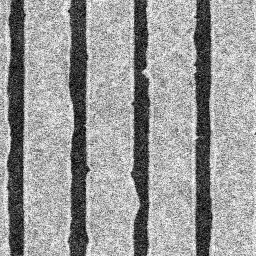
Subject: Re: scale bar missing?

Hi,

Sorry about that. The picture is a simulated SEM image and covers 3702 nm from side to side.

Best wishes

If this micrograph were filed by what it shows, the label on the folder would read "one or a few lines or trenches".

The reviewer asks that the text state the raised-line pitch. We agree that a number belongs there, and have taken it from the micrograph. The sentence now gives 897 nm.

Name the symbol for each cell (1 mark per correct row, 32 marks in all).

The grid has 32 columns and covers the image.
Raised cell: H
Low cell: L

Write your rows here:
HLLHHHHHLLLHHHHHLLLHHHHHLLLHHHHH
HLLHHHHHLLLHHHHHLLLHHHHHLLLHHHHH
HLLHHHHHLLLHHHHHLLLHHHHHLLLHHHHH
HLLHHHHHLLLHHHHHLLLHHHHHLLLHHHHH
HLLHHHHHHLLHHHHHLLLHHHHHLLLHHHHH
HLLHHHHHHLLHHHHHLLLHHHHHLLLHHHHH
HLLHHHHHHLLHHHHHLLLHHHHHLLLHHHHH
HLLHHHHHHLLHHHHHLLLHHHHHLLLHHHHH
HLLHHHHHHLLHHHHHLLLHHHHHLLLHHHHH
HLLHHHHHHLLHHHHHLLLHHHHHLLLHHHHH
HLLHHHHHHLLHHHHHLLLHHHHHLLLHHHHH
HLLHHHHHHLLHHHHHLLLHHHHHLLLHHHHH
HLLHHHHHHLLHHHHHLLLHHHHHLLLHHHHH
HLLHHHHHHLLHHHHHLLLHHHHHLLLHHHHH
HLLHHHHHHLLHHHHHLLLHHHHHLLLHHHHH
HLLHHHHHHLLHHHHHLLLHHHHHLLLHHHHH
HLLHHHHHHLLHHHHHLLLHHHHHLLLHHHHH
HLLHHHHHHLLHHHHHLLLHHHHHLLLHHHHH
HLLHHHHHHLLHHHHHLLLHHHHHLLLHHHHH
HLLHHHHHHLLHHHHHLLLHHHHHLLLHHHHH
HLLHHHHHHLLHHHHHLLLHHHHHLLLHHHHH
HLLHHHHHHLLHHHHHLLLHHHHHLLLHHHHH
HLLHHHHHHLLHHHHHLLLHHHHHLLHHHHHH
HLLHHHHHHLLHHHHHHLLHHHHHLLLHHHHH
HLLHHHHHHLLHHHHHHLLHHHHHLLLHHHHH
HLLHHHHHHLLHHHHHHLLHHHHHLLLHHHHH
HLLHHHHHHLLHHHHHHLLHHHHHLLLHHHHH
HLLHHHHHHLLHHHHHHLLHHHHHLLLHHHHH
HLLHHHHHHLLHHHHHLLLHHHHHLLLHHHHH
HLLHHHHHLLLHHHHHLLLHHHHHLLLHHHHH
HLLHHHHHLLLHHHHHLLLHHHHHLLLHHHHH
HLLHHHHHLLLHHHHHLLLHHHHHLLLHHHHH